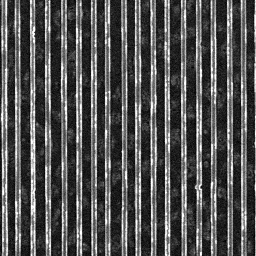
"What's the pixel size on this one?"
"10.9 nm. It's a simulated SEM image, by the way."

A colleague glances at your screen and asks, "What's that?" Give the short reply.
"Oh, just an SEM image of parallel lines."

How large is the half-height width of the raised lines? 55.8 nanometres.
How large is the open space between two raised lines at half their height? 106 nanometres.